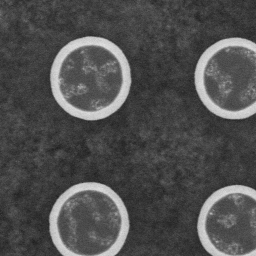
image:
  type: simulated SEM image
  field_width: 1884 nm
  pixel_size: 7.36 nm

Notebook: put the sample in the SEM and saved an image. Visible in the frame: raised bodies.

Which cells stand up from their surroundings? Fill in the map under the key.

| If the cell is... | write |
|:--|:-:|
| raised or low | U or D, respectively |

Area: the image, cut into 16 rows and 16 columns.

DDDDDDDDDDDDDDDD
DDDDDDDDDDDDDDDD
DDDDDDDDDDDDDDDD
DDDDUUUDDDDDDUUU
DDDUUUUUDDDDUUUU
DDDUUUUUDDDDDUUU
DDDDUUUDDDDDDUUU
DDDDDDDDDDDDDDDD
DDDDDDDDDDDDDDDD
DDDDDDDDDDDDDDDD
DDDDDDDDDDDDDDDD
DDDDDDDDDDDDDDDD
DDDDUUUDDDDDDUUU
DDDUUUUUDDDDDUUU
DDDUUUUUDDDDDUUU
DDDDUUUDDDDDDUUU